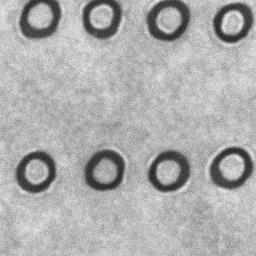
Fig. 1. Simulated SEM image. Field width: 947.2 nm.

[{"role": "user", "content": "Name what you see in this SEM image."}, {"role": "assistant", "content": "ring-shaped grooves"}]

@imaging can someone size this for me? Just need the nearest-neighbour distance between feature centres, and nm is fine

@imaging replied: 244